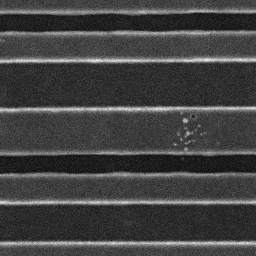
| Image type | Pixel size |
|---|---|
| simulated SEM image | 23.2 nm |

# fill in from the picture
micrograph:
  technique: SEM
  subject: lines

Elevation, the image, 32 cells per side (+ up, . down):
++++++++++++++++++++++++++++++++
++++++++++++..++++..............
................................
................................
++++++++++++++++++++++++++++++++
++++++++++++++++++++++++++++++++
++++++++++++++++++++++++++++++++
+++++++++..++...................
................................
................................
................................
................................
................................
................................
++++++++++++++++++++++++++++++++
++++++++++++++++++++++++++++++++
++++++++++++++++++++++++++++++++
++++++++++++++++++++++++++++++++
++++++++++++++++++++++++++++++++
................................
................................
................................
++++++++++++++++++++++++++++++++
++++++++++++++++++++++++++++++++
++++++++++++++++++++++++++++++++
................................
................................
................................
................................
................................
............................++++
++++++++++++++++++++++++++++++++